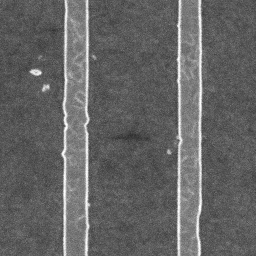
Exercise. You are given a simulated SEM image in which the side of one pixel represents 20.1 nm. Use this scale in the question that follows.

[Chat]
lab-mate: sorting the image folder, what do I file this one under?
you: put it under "one or a few lines or trenches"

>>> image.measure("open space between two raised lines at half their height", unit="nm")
1840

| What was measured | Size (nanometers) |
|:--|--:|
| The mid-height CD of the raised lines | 440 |